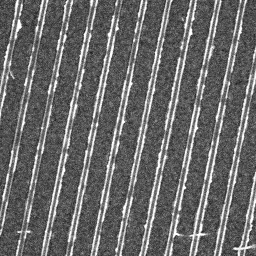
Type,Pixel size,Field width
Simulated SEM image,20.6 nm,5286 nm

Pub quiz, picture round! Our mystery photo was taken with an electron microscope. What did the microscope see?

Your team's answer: parallel lines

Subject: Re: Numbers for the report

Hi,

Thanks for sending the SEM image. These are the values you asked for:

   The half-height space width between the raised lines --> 385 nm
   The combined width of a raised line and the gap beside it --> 0.5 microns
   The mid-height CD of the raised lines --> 0.121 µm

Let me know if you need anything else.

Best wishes